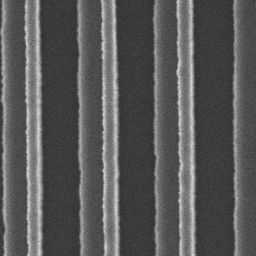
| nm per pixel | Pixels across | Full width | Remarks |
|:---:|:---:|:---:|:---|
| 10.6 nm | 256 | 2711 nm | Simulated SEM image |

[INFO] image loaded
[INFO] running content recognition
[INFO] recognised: lines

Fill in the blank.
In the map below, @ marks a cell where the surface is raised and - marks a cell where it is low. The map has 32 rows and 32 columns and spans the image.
@@@@@-----@@@@-----@@@@@-----@@@
@@@@@-----@@@@-----@@@@@-----@@@
@@@@@-----@@@@-----@@@@@-----@@@
@@@@@-----@@@@-----@@@@@-----@@@
@@@@@-----@@@@-----@@@@@-----@@@
@@@@@-----@@@@-----@@@@@-----@@@
@@@@@-----@@@@-----@@@@@-----@@@
@@@@@-----@@@@-----@@@@@-----@@@
@@@@@-----@@@@-----@@@@@-----@@@
@@@@@-----@@@@-----@@@@@-----@@@
@@@@@-----@@@@-----@@@@@-----@@@
@@@@@-----@@@@-----@@@@@-----@@@
@@@@@-----@@@@-----@@@@@-----@@@
-@@@@-----@@@@-----@@@@@-----@@@
-@@@@-----@@@@------@@@@-----@@@
-@@@@-----@@@@-----@@@@@-----@@@
@@@@@-----@@@@-----@@@@@-----@@@
@@@@@-----@@@@@----@@@@@-----@@@
-@@@@-----@@@@@----@@@@@-----@@@
@@@@@-----@@@@@-----@@@@-----@@@
-@@@@-----@@@@@-----@@@@-----@@@
-@@@@-----@@@@@----@@@@@-----@@@
-@@@@-----@@@@@-----@@@@-----@@@
-@@@@-----@@@@@-----@@@@------@@
-@@@@-----@@@@@-----@@@@------@@
-@@@@-----@@@@@-----@@@@------@@
-@@@@-----@@@@@-----@@@@-----@@@
-@@@@-----@@@@@-----@@@@-----@@@
-@@@@-----@@@@@-----@@@@-----@@@
-@@@@-----@@@@@-----@@@@------@@
-@@@@-----@@@@@-----@@@@------@@
-@@@@-----@@@@@-----@@@@------@@